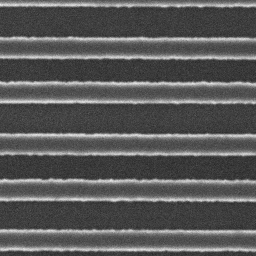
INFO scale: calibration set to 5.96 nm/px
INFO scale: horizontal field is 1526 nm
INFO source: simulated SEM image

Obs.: lines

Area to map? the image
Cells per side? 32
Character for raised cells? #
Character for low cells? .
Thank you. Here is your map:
################################
................................
................................
................................
................................
################################
################################
................................
................................
................................
################################
################################
################################
................................
................................
................................
................................
################################
################################
................................
................................
................................
#.###.#####..#.##..#............
################################
################################
................................
................................
................................
................................
################################
################################
................................